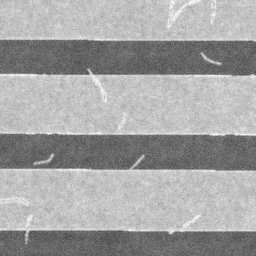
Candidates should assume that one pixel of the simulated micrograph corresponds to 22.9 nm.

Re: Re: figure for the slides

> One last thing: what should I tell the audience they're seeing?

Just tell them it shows lines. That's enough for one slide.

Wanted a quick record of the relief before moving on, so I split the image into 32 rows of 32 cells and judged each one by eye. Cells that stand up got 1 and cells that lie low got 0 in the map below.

11111111111111111111111111111111
11111111111111111111111111111111
11111111111111111111111111111111
11111111111111111111111111111111
11111111111111111111111111111111
00000000000000000000000000000000
00000000000000000000000000000000
00000000000000000000000000000000
00000000000000000000000000000000
11111111111111111111111111111001
11111111111111111111111111111111
11111111111111111111111111111111
11111111111111111111111111111111
11111111111111111111111111111111
11111111111111111111111111111111
11111111111111111111111111111111
11111111111111111111111111111111
00000000000000000000000000000000
00000000000000000000000000000000
00000000000000000000000000000000
00000000000000000000000000000000
11111111111111111111111111111111
11111111111111111111111111111111
11111111111111111111111111111111
11111111111111111111111111111111
11111111111111111111111111111111
11111111111111111111111111111111
11111111111111111111111111111111
11111111111111111111111111111111
00000000000000000000000000000000
00000000000000000000000000000000
00000000000000000000000000000000